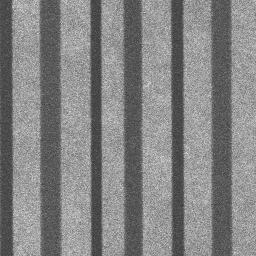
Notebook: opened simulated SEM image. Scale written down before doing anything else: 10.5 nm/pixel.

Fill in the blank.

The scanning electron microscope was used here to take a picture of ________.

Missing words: parallel lines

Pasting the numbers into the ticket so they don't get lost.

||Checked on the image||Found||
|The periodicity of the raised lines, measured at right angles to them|448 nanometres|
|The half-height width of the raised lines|307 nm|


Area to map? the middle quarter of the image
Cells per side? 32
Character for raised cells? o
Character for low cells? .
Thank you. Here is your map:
ooooooo..oooooo....oooooooo...oo
ooooooo..oooooo....oooooooo...oo
ooooooo..oooooo....oooooooo...oo
ooooooo..oooooo....oooooooo...oo
ooooooo..oooooo....oooooooo...oo
ooooooo..oooooo....oooooooo...oo
ooooooo..oooooo....oooooooo...oo
ooooooo..oooooo....oooooooo...oo
ooooooo..oooooo....oooooooo...oo
ooooooo..oooooo....oooooooo...oo
ooooooo..oooooo....oooooooo...oo
ooooooo..oooooo....oooooooo...oo
ooooooo..oooooo....oooooooo...oo
ooooooo..oooooo....oooooooo...oo
ooooooo..oooooo....oooooooo...oo
ooooooo..oooooo....oooooooo...oo
ooooooo..oooooo....oooooooo...oo
ooooooo..oooooo....oooooooo...oo
ooooooo..oooooo....oooooooo...oo
ooooooo..oooooo....oooooooo...oo
ooooooo..oooooo....oooooooo...oo
ooooooo..oooooo....oooooooo...oo
ooooooo..oooooo....oooooooo...oo
ooooooo..oooooo....oooooooo...oo
ooooooo..oooooo....oooooooo...oo
ooooooo..oooooo....oooooooo...oo
ooooooo..oooooo....oooooooo...oo
ooooooo..oooooo....oooooooo...oo
ooooooo..oooooo....oooooooo...oo
ooooooo..oooooo....oooooooo...oo
ooooooo..oooooo....oooooooo...oo
ooooooo..oooooo....oooooooo...oo